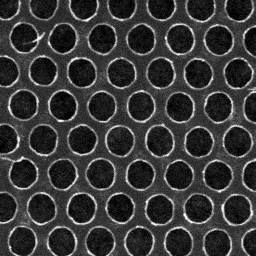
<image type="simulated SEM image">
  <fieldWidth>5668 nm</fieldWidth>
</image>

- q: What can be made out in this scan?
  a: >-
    a regular array of holes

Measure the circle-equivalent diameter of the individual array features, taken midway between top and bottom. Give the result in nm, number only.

626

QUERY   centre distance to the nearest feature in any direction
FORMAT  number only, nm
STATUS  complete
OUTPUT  853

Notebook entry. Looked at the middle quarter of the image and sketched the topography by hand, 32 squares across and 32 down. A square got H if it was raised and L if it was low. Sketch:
HLLLLLLLHHHLLLLLLHHHHLLLLLLHHHHL
HLLLLLLLHHHLLLLLLLHHHLLLLLLHHHLL
HLLLLLLLHHHLLLLLLLHHHLLLLLLLHHLL
HLLLLLLLHHHLLLLLLLHHHLLLLLLLHHLL
HHLLLLLHHHHHLLLLLHHHHLLLLLLHHHHL
HHHLLLHHHHHHHLLLHHHHHHHLLLHHHHHH
HHHHHHHHHHHHHHHHHHHHHHHHHHHHHHHH
LLHHHHHHLLLHHHHHHLLLLHHHHHHLLLHH
LLHHHHHLLLLLHHHHLLLLLLHHHHLLLLLL
LLLHHHLLLLLLLHHHLLLLLLHHHHLLLLLL
LLLHHHLLLLLLLHHHLLLLLLLHHHLLLLLL
LLLHHHLLLLLLLHHHLLLLLLLHHHLLLLLL
LLLHHHHLLLLLLHHHLLLLLLHHHHLLLLLL
LLHHHHHLLLLHHHHHHLLLLHHHHHHLLLLL
HHHHHHHHHHHHHHHHHHHHHHHHHHHHHHHH
HHHHLLHHHHHHHHHHHHHHHHHLLHHHHHHH
HHLLLLLHHHHHLLLLHHHHHHLLLLHHHHHH
HLLLLLLLHHHLLLLLLHHHHLLLLLLHHHHL
HLLLLLLLHHHLLLLLLHHHLLLLLLLHHHLL
HLLLLLLLHHHLLLLLLLHHLLLLLLLHHHLL
HLLLLLLLHHHLLLLLLHHHHLLLLLLHHHLL
HHLLLLLHHHHLLLLLLHHHHLLLLLLHHHHL
HHHHLHHHHHHHHLLLHHHHHHLLLLHHHHHL
HHHHHHHHHHHHHHHHHHHHHHHHHHHHHHHH
LLHHHHHLLLLHHHHHHLLLLHHHHHHHLLHH
LLHHHHLLLLLLHHHHLLLLLLHHHHLLLLLH
LLLHHHLLLLLLLHHHLLLLLLHHHHLLLLLL
LLLHHHLLLLLLLHHHLLLLLLLHHLLLLLLL
LLLHHHLLLLLLLHHHLLLLLLHHHLLLLLLL
LLHHHHLLLLLLHHHHLLLLLLHHHHLLLLLL
LHHHHHHLLLLLHHHHHLLLLHHHHHHLLLLH
HHHHHHHHHHHHHHHHHHHHHHHHHHHHHLHH